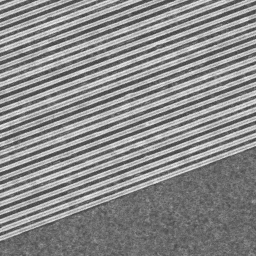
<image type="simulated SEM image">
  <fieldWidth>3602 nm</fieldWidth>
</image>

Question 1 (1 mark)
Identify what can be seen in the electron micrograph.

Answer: parallel lines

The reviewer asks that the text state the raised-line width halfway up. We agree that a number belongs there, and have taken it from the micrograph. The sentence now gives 0.0494 microns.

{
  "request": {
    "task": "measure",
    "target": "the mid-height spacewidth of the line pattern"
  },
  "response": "61 nm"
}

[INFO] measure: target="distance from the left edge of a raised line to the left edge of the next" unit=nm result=113